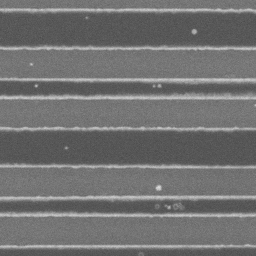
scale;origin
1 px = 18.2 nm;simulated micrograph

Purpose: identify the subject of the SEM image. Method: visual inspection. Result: lines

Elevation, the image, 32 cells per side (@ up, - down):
--------------------------------
@@@@@@@@@@@@@@@@@@@@@@@@@@@@@@@@
@@@@@@@@@@@@@@@@@@@@@@@@@@@@@@@@
@@@@@@@@@@@@@@@@@@@@@@@@@@@@@@@@
@@@@@@@@@@@@@@@@@@@@@@@@@@@@@@@@
@@@@@@@@@@@@@@@@@@@@@@@@@@@@@@@@
--------------------------------
--------------------------------
--------------------------------
--------------------------------
@@@@@@@@@@@@@@@@@@@@@@@@@@@@@@@@
@@@@@@@@@@@@@@@@@@@@@@@@@@@@@@@@
--------------------------------
--------------------------------
--------------------------------
--------------------------------
@@@@@@@@@@@@@@@@@@@@@@@@@@@@@@@@
@@@@@@@@@@@@@@@@@@@@@@@@@@@@@@@@
@@@@@@@@@@@@@@@@@@@@@@@@@@@@@@@@
@@@@@@@@@@@@@@@@@@@@@@@@@@@@@@@@
@@@@@@@@@@@@@@@@@@@@@@@@@@@@@@@@
--------------------------------
--------------------------------
--------------------------------
--------------------------------
@@@@@@@@@@@@@@@@@@@@@@@@@@@@@@@@
@@@@@@@@@@@@@@@@@@@@@@@@@@@@@@@@
--------------------------------
--------------------------------
--------------------------------
--------------------------------
@@@@@@@@@@@@@@@@@@@@@@@@@@@@@@@@